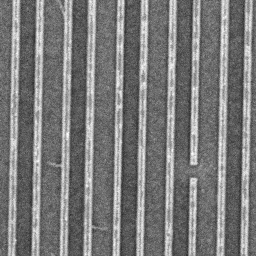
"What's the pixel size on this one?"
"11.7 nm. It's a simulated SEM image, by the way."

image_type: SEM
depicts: parallel lines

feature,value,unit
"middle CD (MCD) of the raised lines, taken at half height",0.0657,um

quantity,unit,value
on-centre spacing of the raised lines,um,0.301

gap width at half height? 0.21 microns